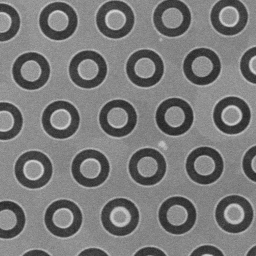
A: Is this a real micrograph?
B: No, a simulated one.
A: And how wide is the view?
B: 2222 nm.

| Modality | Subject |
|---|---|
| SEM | an array of small figures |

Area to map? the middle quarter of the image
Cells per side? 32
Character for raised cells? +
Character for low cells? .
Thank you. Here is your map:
+...++++...++++...+++++..+++++..
+...++++...++++...+++++..+++++..
+...++++...+++++..++++...+++++..
++...++...++++++.........++++++.
++........+++++++.......++++++++
+++.....++++++++++....++++++++++
++++++++++++++++++++++++++++++++
++++++++++++++++++++++++++++++++
+++++++++++++++++++++++++++..+++
.++++++++++.....++++++++.......+
...+++++++.......+++++++........
...++++++...+++...+++++...+++...
+...+++++..+++++..+++++..+++++..
+...++++...+++++..+++++..+++++..
+...+++++..++++...+++++...++++..
+...+++++....+....+++++....+....
...+++++++.......+++++++.......+
..+++++++++.....+++++++++.....++
.++++++++++++.++++++++++++++++++
++++++++++++++++++++++++++++++++
++++++++++++++++++++++++++++++++
+++++...++++++++++.....+++++++++
+++.......+++++++.......+++++++.
++.........++++++...++...++++++.
++...+++...+++++...++++...++++..
++..+++++...++++..+++++...++++..
++..+++++..+++++...++++...++++..
++...+++...+++++...++++..++++++.
++.........++++++........+++++++
+++.......++++++++......++++++++
++++....++++++++++++++++++++++++
++++++++++++++++++++++++++++++++